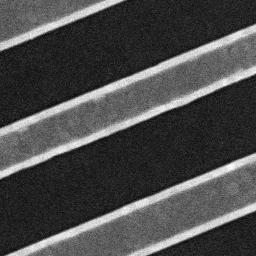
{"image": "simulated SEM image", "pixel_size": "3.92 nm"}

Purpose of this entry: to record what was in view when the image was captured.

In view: one or a few lines or trenches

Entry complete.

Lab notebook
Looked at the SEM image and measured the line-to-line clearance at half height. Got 303 nm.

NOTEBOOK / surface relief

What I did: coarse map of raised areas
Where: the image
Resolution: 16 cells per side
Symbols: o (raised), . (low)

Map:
oooooo..........
oooo............
o.............oo
............oooo
.........ooooooo
.......oooooo...
....ooooooo.....
..ooooooo.......
oooooo..........
oooo............
o.............oo
............oooo
.........ooooooo
.......oooooooo.
....oooooooo....
..oooooooo......